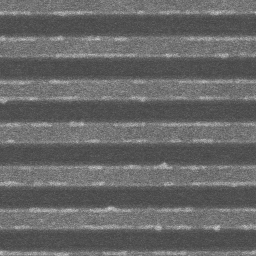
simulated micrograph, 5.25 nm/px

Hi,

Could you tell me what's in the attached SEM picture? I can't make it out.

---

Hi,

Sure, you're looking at parallel lines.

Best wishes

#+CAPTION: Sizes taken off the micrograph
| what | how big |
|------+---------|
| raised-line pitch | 225 nm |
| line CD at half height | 119 nanometers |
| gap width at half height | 20.1 pixels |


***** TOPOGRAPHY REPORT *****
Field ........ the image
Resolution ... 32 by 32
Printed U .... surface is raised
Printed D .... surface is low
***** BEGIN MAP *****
UUUUUUUUUUUUUUUUUUUUUUUUUUUUUUUU
UUUUUUUUUUUUUUUUUUUUUUUUUUUUUUUU
DDDDDDDDDDDDDDDDDDDDDDDDDDDDDDDD
DDDDDDDDDDDDDDDDDDDDDDDDDDDDDDDD
DDDDDDDDDDDDUUUUUUUUUUUUUUUUUUUU
UUUUUUUUUUUUUUUUUUUUUUUUUUUUUUUU
UUUUUUUUUUUUUUUUUUUUUUUUUUUUUUUU
DDDDDDDDDDDDDDDDDDDDDDDDDDDDDDDD
DDDDDDDDDDDDDDDDDDDDDDDDDDDDDDDD
DDDDDDDDDDDDDDDDDDDDDDDDDDDDDDDD
UUUUUUUUUUUUUUUUUUUUUUUUUUUUUUUU
UUUUUUUUUUUUUUUUUUUUUUUUUUUUUUUU
UUUUUUUUUUUUUUUUUUUUUUUUUUUUUUUU
DDDDDDDDDDDDDDDDDDDDDDDDDDDDDDDD
DDDDDDDDDDDDDDDDDDDDDDDDDDDDDDDD
UUUUUUUUUUUUUUUUUUUUUUUUUUUUUUUU
UUUUUUUUUUUUUUUUUUUUUUUUUUUUUUUU
UUUUUUUUUUUUUUUUUUUUUUUUUUUUUUUU
DDDDDDDDDDDDDDDDDDDDDDDDDDDDDDDD
DDDDDDDDDDDDDDDDDDDDDDDDDDDDDDDD
DDDDDDDDDDDDDDDDDDDDUDDDDDDDDDDD
UUUUUUUUUUUUUUUUUUUUUUUUUUUUUUUU
UUUUUUUUUUUUUUUUUUUUUUUUUUUUUUUU
DDDDDDDDDDDDDDDDDDDDDDDDDDDDDDDD
DDDDDDDDDDDDDDDDDDDDDDDDDDDDDDDD
DDDDDDDDDDDDDDDDDDDDDDDDDDDDDDDD
UUUUUUUUUUUUUUUUUUUUUUUUUUUUUUUU
UUUUUUUUUUUUUUUUUUUUUUUUUUUUUUUU
UUUUUUUUUUUUUUUUUUUUUUUUUUUUUUUU
DDDDDDDDDDDDDDDDDDDDDDDDDDDDDDDD
DDDDDDDDDDDDDDDDDDDDDDDDDDDDDDDD
UUUUUUUUUUUUUUUUUUUUUUUUUUUUUUUU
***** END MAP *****